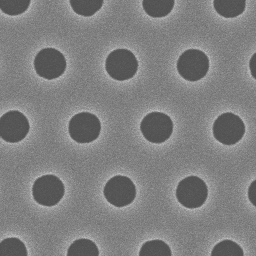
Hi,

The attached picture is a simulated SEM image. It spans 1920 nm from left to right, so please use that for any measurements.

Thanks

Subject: a regular array of holes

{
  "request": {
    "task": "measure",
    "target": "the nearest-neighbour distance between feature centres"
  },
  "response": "538 nm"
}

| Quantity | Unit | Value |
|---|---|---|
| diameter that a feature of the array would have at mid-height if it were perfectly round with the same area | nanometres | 244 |